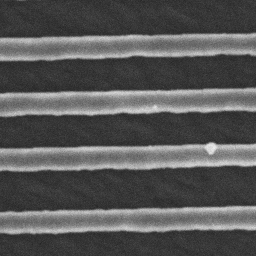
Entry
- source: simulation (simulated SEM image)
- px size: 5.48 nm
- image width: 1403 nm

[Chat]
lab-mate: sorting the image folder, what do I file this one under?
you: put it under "lines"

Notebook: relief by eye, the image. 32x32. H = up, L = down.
LLLLLLLLLLLLLLLLLLLLLLLLLLLLLLLL
LLLLLLLLLLLLLLLLLLLLLLLLLLLLLLLL
LLLLLLLLLLLLLLLLLLLLLLLLLLLLLLLL
LLLLLLLLLLLLLLLLLLLLLLLLLLLLLLLL
LLLLLLLLLLLLLLLLHHLHHHHHHHHHHHHH
HHHHHHHHHHHHHHHHHHHHHHHHHHHHHHHH
HHHHHHHHHHHHHHHHHHHHHHHHHHHHHHHH
HHHHHLLLLLLLLLLLLLLLLLLLLLLLLLLL
LLLLLLLLLLLLLLLLLLLLLLLLLLLLLLLL
LLLLLLLLLLLLLLLLLLLLLLLLLLLLLLLL
LLLLLLLLLLLLLLLLLLLLLLLLLLLLLLLL
LLLLLLLLLLLLLLHHHHHHHHHHHHHHHHHH
HHHHHHHHHHHHHHHHHHHHHHHHHHHHHHHH
HHHHHHHHHHHHHHHHHHHHHHHHHHHHHHHH
HHLLLLLLLLLLLLLLLLLLLLLLLLLLLLLL
LLLLLLLLLLLLLLLLLLLLLLLLLLLLLLLL
LLLLLLLLLLLLLLLLLLLLLLLLLLLLLLLL
LLLLLLLLLLLLLLLLLLLLLLLLLLLLLLLL
LLLLLHHHHHHHHHHHHHHHHHHHHHHHHHHH
HHHHHHHHHHHHHHHHHHHHHHHHHHHHHHHH
HHHHHHHHHHHHHHHHHHHHHHHHHHHHHHHH
LLLLLLLLLLLLLLLLLLLLLLLLLLLLLLLL
LLLLLLLLLLLLLLLLLLLLLLLLLLLLLLLL
LLLLLLLLLLLLLLLLLLLLLLLLLLLLLLLL
LLLLLLLLLLLLLLLLLLLLLLLLLLLLLLLL
LLLLLLLLLLLLLLLLLLLLLLLLLLLLLLLL
LHLHHHHHHHHHHHHHHHHHHHHHHHHHHHHH
HHHHHHHHHHHHHHHHHHHHHHHHHHHHHHHH
HHHHHHHHHHHHHHHHHHHHHHHHHHHHHHHH
LLLLLLLLLLLLLLLLLLLLLLLLLLLLLLLL
LLLLLLLLLLLLLLLLLLLLLLLLLLLLLLLL
LLLLLLLLLLLLLLLLLLLLLLLLLLLLLLLL